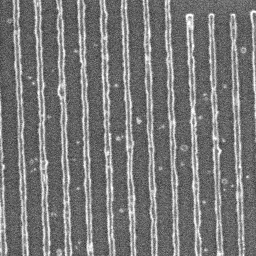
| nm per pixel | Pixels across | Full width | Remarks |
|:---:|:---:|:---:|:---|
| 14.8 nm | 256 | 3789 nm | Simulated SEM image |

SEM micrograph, parallel lines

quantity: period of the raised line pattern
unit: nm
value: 320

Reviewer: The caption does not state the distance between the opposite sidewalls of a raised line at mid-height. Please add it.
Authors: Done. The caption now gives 69.3 nm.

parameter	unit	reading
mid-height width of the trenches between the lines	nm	250